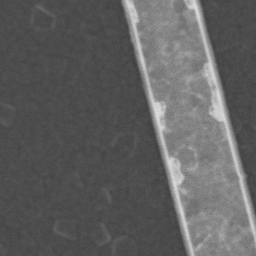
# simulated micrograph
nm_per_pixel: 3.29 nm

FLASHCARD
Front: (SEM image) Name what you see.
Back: one or a few lines or trenches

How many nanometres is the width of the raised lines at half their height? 214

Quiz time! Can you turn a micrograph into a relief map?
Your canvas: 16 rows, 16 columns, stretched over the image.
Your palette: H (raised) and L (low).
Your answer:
LLLLLLLLHHHHLLLL
LLLLLLLLHHHHHLLL
LLLLLLLLLHHHHLLL
LLLLLLLLLHHHHLLL
LLLLLLLLLHHHHLLL
LLLLLLLLLHHHHHLL
LLLLLLLLLLHHHHLL
LLLLLLLLLLHHHHLL
LLLLLLLLLLHHHHLL
LLLLLLLLLLHHHHHL
LLLLLLLLLLLHHHHL
LLLLLLLLLLLHHHHL
LLLLLLLLLLLHHHHL
LLLLLLLLLLLHHHHH
LLLLLLLLLLLLHHHH
LLLLLLLLLLLLHHHH